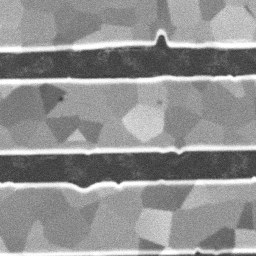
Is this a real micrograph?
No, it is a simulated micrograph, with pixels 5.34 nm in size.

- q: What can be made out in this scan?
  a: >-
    one or a few lines or trenches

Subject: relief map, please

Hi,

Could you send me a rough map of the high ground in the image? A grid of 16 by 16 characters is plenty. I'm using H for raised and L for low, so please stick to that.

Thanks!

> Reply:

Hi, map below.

HHHHHHHHHHHHHHHH
HHHHHHHHHHHHHHHH
HHHHHHHHHHHHHHHH
LLLLLLLLLLLLLLLL
LLLLLLLLLLLLLLLL
HHHHHHHHHHHHHHHH
HHHHHHHHHHHHHHHH
HHHHHHHHHHHHHHHH
HHHHHHHHHHHHHHHH
HHLLLLLLLLLLLLLL
LLLLLLLLLLLLLLLL
LLLLLLLLHHHHHHHH
HHHHHHHHHHHHHHHH
HHHHHHHHHHHHHHHH
HHHHHHHHHHHHHHHH
HHHHHHHHHHHHHHHH